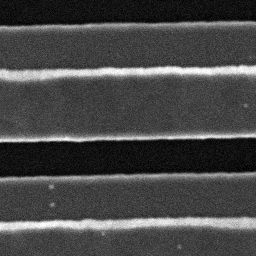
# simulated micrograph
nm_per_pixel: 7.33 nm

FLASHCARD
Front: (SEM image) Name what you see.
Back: lines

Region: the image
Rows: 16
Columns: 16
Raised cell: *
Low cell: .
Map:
................
...........*****
****************
****************
****************
****************
****************
****************
****************
................
................
****************
****************
****************
****************
****************